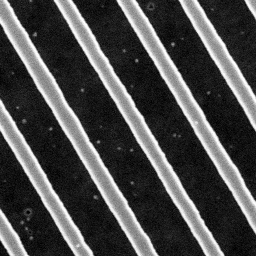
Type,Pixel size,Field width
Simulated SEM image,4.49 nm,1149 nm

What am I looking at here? lines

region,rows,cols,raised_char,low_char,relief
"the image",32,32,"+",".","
+......++......++......++......+
++......++.....+++.....++......+
++......++......++......++......
+++......++......++.....+++.....
.+++.....+++.....+++.....++.....
..++......++......++......++....
..+++......++.....+++.....++....
...++......++......++......++...
...+++......++......++.....+++..
....+++.....+++.....+++.....++..
....+++......++......++.....+++.
.....+++......++.....+++.....+++
......++......++......++......++
+.....+++......++......++.....++
+......++......+++.....+++.....+
++......++......++......++.....+
++......+++......++.....+++.....
.++......++......++......++.....
.+++.....+++......++......++....
..++......++......+++.....++....
...++......++......++......++...
...++......+++......++.....+++..
....++......++......++......++..
....+++.....+++......++......++.
.....++......++......++......++.
......++.....+++......++......++
......++......+++......++.....++
+......++......++......++......+
++.....+++.....+++......++......
++......++......++......++......
+++......++.....+++......++.....
.++......++......++......+++....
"